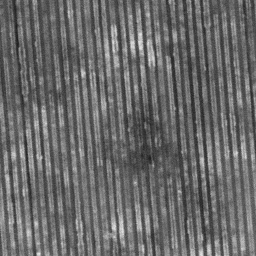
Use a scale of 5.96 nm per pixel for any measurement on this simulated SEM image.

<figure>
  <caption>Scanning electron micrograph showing parallel lines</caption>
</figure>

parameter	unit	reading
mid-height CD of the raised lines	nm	27.5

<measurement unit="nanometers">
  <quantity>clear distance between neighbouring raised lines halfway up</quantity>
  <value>22.3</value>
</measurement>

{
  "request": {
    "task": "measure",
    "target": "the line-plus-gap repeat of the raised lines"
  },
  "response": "8.49 pixels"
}